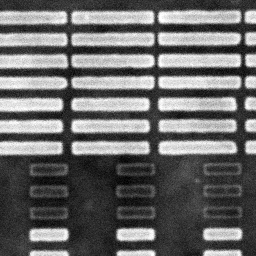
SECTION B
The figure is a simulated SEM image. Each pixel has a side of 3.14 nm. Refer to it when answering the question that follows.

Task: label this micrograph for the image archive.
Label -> wiring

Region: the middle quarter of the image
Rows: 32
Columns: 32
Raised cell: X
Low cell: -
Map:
X-XXXXXXXXXXXXXXXXXXXX--XXXXXXXX
--------------------------------
--------------------------------
--------------------XX----------
--XXXXXXXXXXXXXXXXXXXX--XXXXXXXX
--XXXXXXXXXXXXXXXXXXXX--XXXXXXXX
--------------------------------
--------------------------------
--------------------------------
--XXXXXXXXXXXXXXXXXXX---XXXXXXXX
--XXXXXXXXXXXXXXXXXXX---XXXXXXXX
--------------------------------
--------------------------------
--------------------------------
--XXXXXXXXXXXXXXXXXXX---XXXXXXXX
--XXXXXXXXXXXXXXXXXXX---XXXXXXXX
--XXXXXXXXXXXXXXXXXXX---XXXXXXXX
--------------------------------
--------------------------------
--------------------------------
--XXXXXXXXXXXXXXXXXXX---XXXXXXXX
--XXXXXXXXXXXXXXXXXXX---XXXXXXXX
--------------------------------
--------------------------------
--------------------------------
X-------------XXXXXXXX----------
X-------------XXXXXXXX----------
--------------XXXXXXXX----------
--------------------------------
--------------------------------
-------------------XX-----------
X------------XXXXXXXXX----------